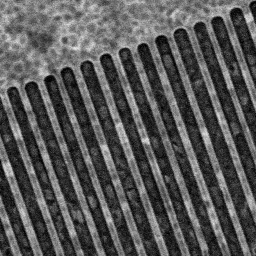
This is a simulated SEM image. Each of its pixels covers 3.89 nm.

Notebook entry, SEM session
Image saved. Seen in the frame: parallel lines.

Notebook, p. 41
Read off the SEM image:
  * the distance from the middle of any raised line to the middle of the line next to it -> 77.1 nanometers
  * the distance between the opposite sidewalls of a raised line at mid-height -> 25.2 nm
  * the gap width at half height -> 0.0546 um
